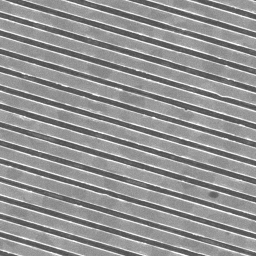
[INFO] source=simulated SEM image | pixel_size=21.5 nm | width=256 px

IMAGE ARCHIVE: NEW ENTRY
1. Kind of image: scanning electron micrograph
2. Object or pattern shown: parallel lines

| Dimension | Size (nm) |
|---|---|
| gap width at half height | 114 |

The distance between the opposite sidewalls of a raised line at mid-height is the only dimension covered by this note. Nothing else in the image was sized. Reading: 263 nm